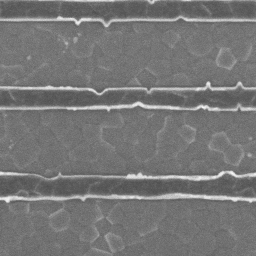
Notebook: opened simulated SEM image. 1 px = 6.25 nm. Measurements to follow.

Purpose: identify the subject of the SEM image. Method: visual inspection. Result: one or a few lines or trenches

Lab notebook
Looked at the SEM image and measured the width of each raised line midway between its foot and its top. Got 139 nanometres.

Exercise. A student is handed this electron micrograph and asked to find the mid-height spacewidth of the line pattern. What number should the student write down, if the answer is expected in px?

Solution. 66.8